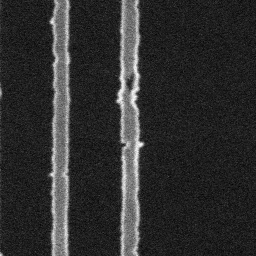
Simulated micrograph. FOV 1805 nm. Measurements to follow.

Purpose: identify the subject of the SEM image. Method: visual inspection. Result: one or a few lines or trenches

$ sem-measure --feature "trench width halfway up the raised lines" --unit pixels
53.9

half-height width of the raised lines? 0.0996 um